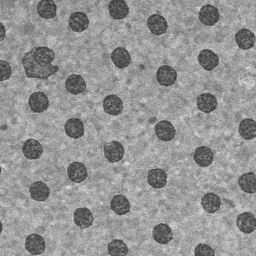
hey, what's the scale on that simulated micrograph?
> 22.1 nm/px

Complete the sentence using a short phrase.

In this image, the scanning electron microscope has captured a regular array of holes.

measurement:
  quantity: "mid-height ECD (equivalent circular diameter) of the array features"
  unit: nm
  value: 474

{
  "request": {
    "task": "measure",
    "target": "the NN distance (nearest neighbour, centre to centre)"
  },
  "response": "43.7 px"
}